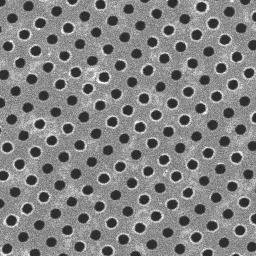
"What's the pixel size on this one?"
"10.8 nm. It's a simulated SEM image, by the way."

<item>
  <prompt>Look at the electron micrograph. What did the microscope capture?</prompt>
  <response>a regular array of holes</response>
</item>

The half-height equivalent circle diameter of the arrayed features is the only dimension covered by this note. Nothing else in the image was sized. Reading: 116 nanometres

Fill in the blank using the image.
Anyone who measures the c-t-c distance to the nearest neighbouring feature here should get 19.8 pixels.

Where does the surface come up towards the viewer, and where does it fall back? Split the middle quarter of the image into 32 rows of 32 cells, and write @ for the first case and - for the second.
@@@@@@@@@@@@@--@@@@@@-@@@@@@@@@-
@@--@@@@@@@@@--@@@@@--@@@@@@@@@@
@@--@@@@@--@@@@@@@@@--@@@@@--@@@
@@@@@@@@@--@@@@@--@@@@@@@@@--@@@
@@@@@@@@@@-@@@@@--@@@@@@-@@@@@@@
@@@@@--@@@@@@@@@--@@@@@--@@@@@@@
@@@@@--@@@@@--@@@@@@@@@--@@@@@--
@@@@@@@@@@@@--@@@@@--@@@@@@@@@--
@--@@@@@@@@@--@@@@@--@@@@@@@@@@@
@--@@@@@--@@@@@@@@@--@@@@@--@@@@
@@@@@@@@--@@@@@--@@@@@@@@@--@@@@
@@@@@@@@--@@@@@--@@@@@@@@@@@@@@@
@@@@--@@@@@@@@@--@@@@@--@@@@@@@@
@@@@--@@@@@--@@@@@@@@@--@@@@@--@
@@@@--@@@@@--@@@@@@@@@@@@@@@@--@
--@@@@@@@@@--@@@@@--@@@@@@@@@@@@
--@@@@@--@@@@@@@@@--@@@@@--@@@@@
@@@@@@@--@@@@@@-@@@@@@@@@--@@@@@
@@@@@@@--@@@@@--@@@@@@@@@@@@@@@@
@@@--@@@@@@@@@--@@@@@--@@@@@@@@@
@@@--@@@@@--@@@@@@@@@--@@@@@--@@
@@@--@@@@@--@@@@@@-@@@@@@@@@--@@
-@@@@@@@@@--@@@@@--@@@@@@@@@@@@@
-@@@@@--@@@@@@@@@--@@@@@--@@@@@@
-@@@@@--@@@@@@@@@@@@@@@@--@@@@@-
@@@@@@--@@@@@--@@@@@@@@@@@@@@@@-
@@--@@@@@@@@@--@@@@@--@@@@@@@@@@
@@--@@@@@--@@@@@@@@@--@@@@@--@@@
@@--@@@@@--@@@@@@@@@@@@@@@@--@@@
@@@@@@@@@--@@@@@--@@@@@@@@@@@@@@
@@@@@--@@@@@@@@@--@@@@@--@@@@@@@
@@@@---@@@@@@@@@@@@@@@@--@@@@@--